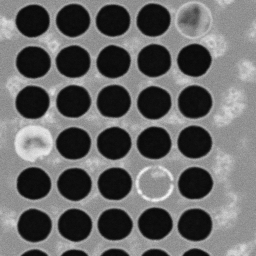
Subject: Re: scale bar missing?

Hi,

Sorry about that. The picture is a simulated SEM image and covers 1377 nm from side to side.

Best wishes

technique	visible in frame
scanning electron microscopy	a regular array of holes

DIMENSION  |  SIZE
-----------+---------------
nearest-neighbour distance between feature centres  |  215 nm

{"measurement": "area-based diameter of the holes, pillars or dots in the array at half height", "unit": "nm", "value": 182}